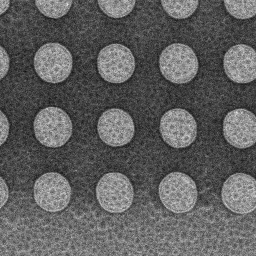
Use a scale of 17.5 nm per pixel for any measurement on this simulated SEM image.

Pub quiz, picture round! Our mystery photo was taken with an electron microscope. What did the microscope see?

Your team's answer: a regular array of raised bodies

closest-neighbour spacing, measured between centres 1100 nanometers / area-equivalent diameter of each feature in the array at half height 0.672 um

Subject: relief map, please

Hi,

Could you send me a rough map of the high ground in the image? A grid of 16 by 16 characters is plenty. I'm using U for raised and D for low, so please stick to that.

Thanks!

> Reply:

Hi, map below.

DDUUDDUUDDUUDDUU
DDDDDDDDDDDDDDDD
DDDDDDDDDDDDDDDD
DDUUDDUUDDUUDDUU
DDUUDDUUDDUUDDUU
DDDDDDDDDDDDDDDD
DDDDDDDDDDDDDDDD
DDUUDDUUDDUUDDUU
DDUUDDUUDDUUDDUU
DDDDDDDDDDDDDDDD
DDDDDDDDDDDDDDDD
DDUUDDUUDDUUDDUU
DDUUDDUUDDUUDDUU
DDDDDDDDDDDDDDDD
DDDDDDDDDDDDDDDD
DDDDDDDDDDDDDDDD